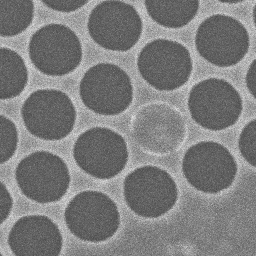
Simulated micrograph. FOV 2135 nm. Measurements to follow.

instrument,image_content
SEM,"a regular array of holes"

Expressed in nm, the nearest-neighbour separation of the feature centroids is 523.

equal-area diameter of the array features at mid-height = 450 nanometers